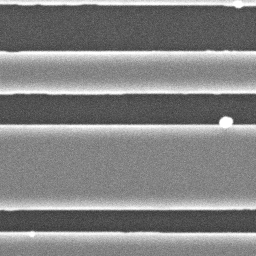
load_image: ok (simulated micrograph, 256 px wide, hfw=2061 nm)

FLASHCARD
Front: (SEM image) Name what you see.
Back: lines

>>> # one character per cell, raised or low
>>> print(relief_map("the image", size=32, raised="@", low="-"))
--@@@@@@@@--@@@@@@@@@@@@@@@@@@@@
--------------------------------
--------------------------------
--------------------------------
--------------------------------
--------------------------------
@-@@@@@@@@@@@@@@@@@@@@@@@@@@@@@@
@@@@@@@@@@@@@@@@@@@@@@@@@@@@@@@@
@@@@@@@@@@@@@@@@@@@@@@@@@@@@@@@@
@@@@@@@@@@@@@@@@@@@@@@@@@@@@@@@@
@@@@@@@@@@@@@@@@@@@@@@@@@@@@@@@@
@@@@@@@@@@@@@@@@@@@@@@@@@@@@@@@@
--------------------------------
--------------------------------
--------------------------------
---------------------------@@---
@@@@@@@@@@@@@@@@@@@@@@@@@@@@@@@@
@@@@@@@@@@@@@@@@@@@@@@@@@@@@@@@@
@@@@@@@@@@@@@@@@@@@@@@@@@@@@@@@@
@@@@@@@@@@@@@@@@@@@@@@@@@@@@@@@@
@@@@@@@@@@@@@@@@@@@@@@@@@@@@@@@@
@@@@@@@@@@@@@@@@@@@@@@@@@@@@@@@@
@@@@@@@@@@@@@@@@@@@@@@@@@@@@@@@@
@@@@@@@@@@@@@@@@@@@@@@@@@@@@@@@@
@@@@@@@@@@@@@@@@@@@@@@@@@@@@@@@@
@@@@@@@@@@@@@@@@@@@@@@@@@@@@@@@@
--------------------------------
--------------------------------
--------------------------------
@@@@@@@@@@@@@@@@@@@@@@@@@@@@@@@@
@@@@@@@@@@@@@@@@@@@@@@@@@@@@@@@@
@@@@@@@@@@@@@@@@@@@@@@@@@@@@@@@@